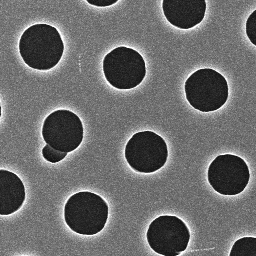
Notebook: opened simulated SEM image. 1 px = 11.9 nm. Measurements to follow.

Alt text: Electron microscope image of holes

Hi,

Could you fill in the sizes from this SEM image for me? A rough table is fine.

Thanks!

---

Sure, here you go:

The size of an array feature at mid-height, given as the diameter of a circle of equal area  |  521 nm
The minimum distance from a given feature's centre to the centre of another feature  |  1010 nm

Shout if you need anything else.